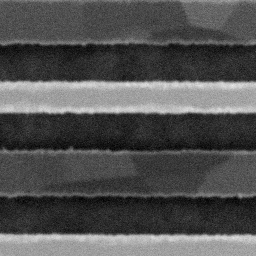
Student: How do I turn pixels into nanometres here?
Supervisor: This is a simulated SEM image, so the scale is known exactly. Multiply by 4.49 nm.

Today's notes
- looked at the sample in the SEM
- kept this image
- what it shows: lines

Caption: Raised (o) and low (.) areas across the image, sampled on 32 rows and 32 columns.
oooooooooooooooooooooooooooooooo
oooooooooooooooooooooooooooooooo
oooooooooooooooooooooooooooooooo
oooooooooooooooooooooooooooooooo
oooooooooooooooooooooooooooooooo
o....oo..oo........oo..o....o.oo
................................
................................
................................
................................
..........oo...oo.o..oo.........
oooooooooooooooooooooooooooooooo
oooooooooooooooooooooooooooooooo
oooooooooooooooooooooooooooooooo
................................
................................
................................
................................
................................
oooooooooooooooooooooooooooooooo
oooooooooooooooooooooooooooooooo
oooooooooooooooooooooooooooooooo
oooooooooooooooooooooooooooooooo
oooooooooooooooooooooooooooooooo
.o..o..oo.oo...o.ooooo.ooooooooo
................................
................................
................................
................................
................................
oooooooooooooooooooooooooooooooo
oooooooooooooooooooooooooooooooo